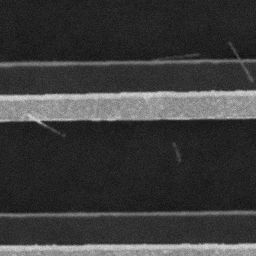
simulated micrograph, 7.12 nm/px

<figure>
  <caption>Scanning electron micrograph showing lines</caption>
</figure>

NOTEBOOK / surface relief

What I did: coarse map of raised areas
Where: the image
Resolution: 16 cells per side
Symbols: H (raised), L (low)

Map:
LLLLLLLLLLLLLLLL
LLLLLLLLLLLLLLLL
LLLLLLLLLLLLLLLL
LLLLLLLLLLLLLLLL
HHHHHHHHHHHHHHHH
HHHHHHHHHHHHHHHH
HHHHHHHHHHHHHHHH
HHHLLLLLLLLLLLLL
LLLLLLLLLLLLLLLL
LLLLLLLLLLLLLLLL
LLLLLLLLLLLLLLLL
LLLLLLLLLLLLLLLL
LLLLLLLLLLLLLLLL
HHHHHHHHHHHHHHHH
HHHHHHHHHHHHHHHH
HHHHHHHHHHHHHHHH